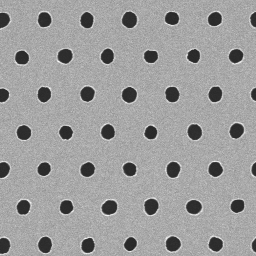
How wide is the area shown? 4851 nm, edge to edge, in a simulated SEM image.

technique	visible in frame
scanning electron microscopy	a regular array of holes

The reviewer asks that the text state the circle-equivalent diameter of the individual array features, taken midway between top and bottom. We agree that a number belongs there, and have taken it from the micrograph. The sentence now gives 275 nm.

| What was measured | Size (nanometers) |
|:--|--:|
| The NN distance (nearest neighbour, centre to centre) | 798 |